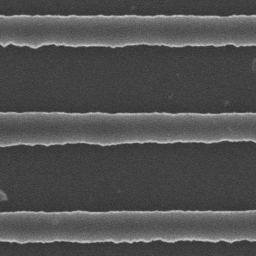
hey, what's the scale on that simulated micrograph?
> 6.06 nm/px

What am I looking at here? lines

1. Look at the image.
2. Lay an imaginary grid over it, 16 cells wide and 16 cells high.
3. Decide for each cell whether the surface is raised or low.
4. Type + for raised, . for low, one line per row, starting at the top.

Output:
................
++++++++++++++++
++++++++++++++++
................
................
................
................
++++++++++++++++
++++++++++++++++
................
................
................
................
++++++++++++++++
++++++++++++++++
................